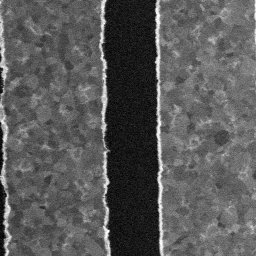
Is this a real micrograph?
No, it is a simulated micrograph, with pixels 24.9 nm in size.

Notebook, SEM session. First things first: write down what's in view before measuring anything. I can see one or a few lines or trenches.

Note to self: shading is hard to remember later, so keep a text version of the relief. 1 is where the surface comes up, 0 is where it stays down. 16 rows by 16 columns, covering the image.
1111110000111111
1111110000111111
1111110000111111
1111110000111111
1111111000111111
1111111000111111
1111111000111111
1111110000111111
1111110000111111
1111111000111111
1111111000111111
1111111000111111
1111111000111111
1111111000111111
1111111000111111
1111111000111111